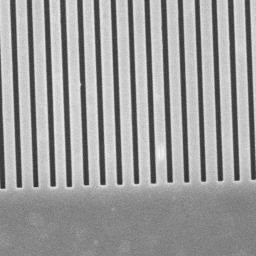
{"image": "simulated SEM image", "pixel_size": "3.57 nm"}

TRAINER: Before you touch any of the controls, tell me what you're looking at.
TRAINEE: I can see parallel lines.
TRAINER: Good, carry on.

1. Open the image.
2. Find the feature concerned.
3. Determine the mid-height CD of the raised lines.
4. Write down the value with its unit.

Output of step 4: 11.1 pixels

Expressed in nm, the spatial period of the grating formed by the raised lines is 59.7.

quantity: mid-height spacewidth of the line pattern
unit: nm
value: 19.6